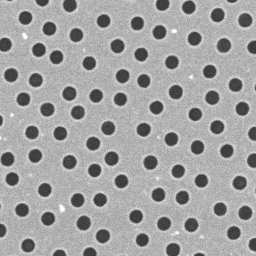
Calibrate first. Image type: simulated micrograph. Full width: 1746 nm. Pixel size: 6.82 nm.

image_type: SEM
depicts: a regular array of holes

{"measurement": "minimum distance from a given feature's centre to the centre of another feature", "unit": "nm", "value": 169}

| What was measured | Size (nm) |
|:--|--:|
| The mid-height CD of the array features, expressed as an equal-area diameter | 95.6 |